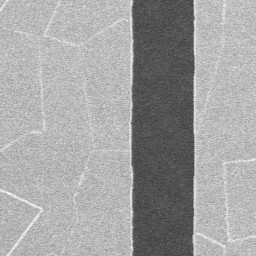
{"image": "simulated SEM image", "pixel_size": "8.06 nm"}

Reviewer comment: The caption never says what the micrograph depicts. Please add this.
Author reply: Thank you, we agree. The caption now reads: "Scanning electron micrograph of one or a few lines or trenches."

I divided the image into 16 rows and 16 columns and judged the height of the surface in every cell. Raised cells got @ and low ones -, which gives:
@@@@@@@@----@@@@
@@@@@@@@----@@@@
@@@@@@@@----@@@@
@@@@@@@@----@@@@
@@@@@@@@----@@@@
@@@@@@@@----@@@@
@@@@@@@@----@@@@
@@@@@@@@----@@@@
@@@@@@@@----@@@@
@@@@@@@@----@@@@
@@@@@@@@----@@@@
@@@@@@@@----@@@@
@@@@@@@@----@@@@
@@@@@@@@----@@@@
@@@@@@@@----@@@@
@@@@@@@@----@@@@